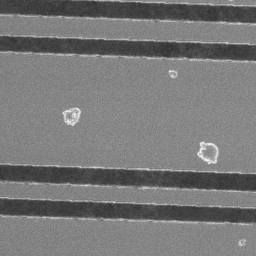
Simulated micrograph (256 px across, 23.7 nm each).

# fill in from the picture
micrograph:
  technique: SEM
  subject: lines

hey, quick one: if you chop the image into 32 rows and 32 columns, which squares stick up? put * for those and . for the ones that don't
************************........
********************************
.................***************
................................
**..............................
********************************
********************************
...........................*****
................................
................................
................................
................................
................................
................................
........**......................
................................
................................
................................
.........................**.....
.........................**.....
................................
***************************.....
********************************
.....................***********
................................
********************............
********************************
.................***************
................................
................................
................................
................................